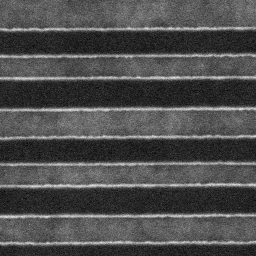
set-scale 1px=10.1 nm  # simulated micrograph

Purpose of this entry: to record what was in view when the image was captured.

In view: lines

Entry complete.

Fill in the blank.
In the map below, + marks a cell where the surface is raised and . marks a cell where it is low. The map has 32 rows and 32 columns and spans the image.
................................
................................
................................
................................
++++++++++++++++++++++++++++++++
++++++++++++++++++++++++++++++++
++++++++++++++++++++++++++++++++
................................
................................
................................
++++++++++++++++++++++++++++++++
++++++++++++++++++++++++++++++++
++++++++++++++++++++++++++++++++
++++++++++++++++++++++++++++++++
................................
................................
................................
++++++++++++++++++++++++++++++++
++++++++++++++++++++++++++++++++
++++++++++++++++++++++++++++++++
+++++++++++++++++++.............
................................
................................
++++++++++++++++++++++++++++++++
++++++++++++++++++++++++++++++++
++++++++++++++++++++++++++++++++
++++++++++++++++++++++++++++++++
................................
................................
................................
++++++++++++++++++++++++++++++++
++++++++++++++++++++++++++++++++